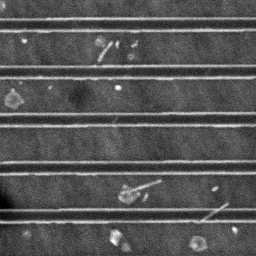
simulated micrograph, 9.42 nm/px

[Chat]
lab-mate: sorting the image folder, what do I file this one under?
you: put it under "lines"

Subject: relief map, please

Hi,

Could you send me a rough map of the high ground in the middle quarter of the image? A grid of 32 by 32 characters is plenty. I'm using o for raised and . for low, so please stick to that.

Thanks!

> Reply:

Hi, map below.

....................oooooooooooo
oooooooooooooooooooooooooooooooo
oooooooooooooooooooooooooooooooo
oooooooooooooooooooooooooooooooo
................................
................................
................................
................................
................................
................................
................................
................................
oooooooooooooooooooooooooooooooo
oooooooooooooooooooooooooooooooo
oooooooooooooooooooooooooooooooo
ooo.............................
................................
................................
................................
................................
................................
................................
................................
................................
...........................oo...
oooooooooooooooooooooooooooooooo
oooooooooooooooooooooooooooooooo
................................
................................
................................
................................
................................